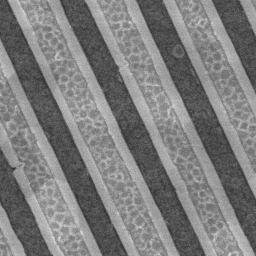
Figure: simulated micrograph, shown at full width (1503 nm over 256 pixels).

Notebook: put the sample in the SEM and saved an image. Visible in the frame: one or a few lines or trenches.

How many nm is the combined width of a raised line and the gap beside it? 407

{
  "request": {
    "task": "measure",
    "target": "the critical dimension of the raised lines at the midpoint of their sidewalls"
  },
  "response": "206 nm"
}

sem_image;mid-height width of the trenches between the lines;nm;198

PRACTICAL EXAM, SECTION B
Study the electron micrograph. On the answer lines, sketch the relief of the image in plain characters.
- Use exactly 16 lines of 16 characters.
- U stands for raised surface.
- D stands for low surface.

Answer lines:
DUUUDDUUDDDUUDDD
DDUUDDUUUDDUUUDD
DDUUDDDUUDDDUUDD
DDUUUDDUUUDDUUUD
UDDUUDDDUUDDDUUD
UDDUUUDDUUUDDUUD
UUDDUUDDDUUDDDUU
UUDDUUUDDUUUDDUU
UUUDDUUDDDUUDDUU
DUUDDUUUDDUUUDDU
DUUDDDUUDDDUUDDU
DUUUDDUUUDDUUDDD
DDUUDDDUUDDDUUDD
DDUUUDDUUUDDUUDD
UDDUUDDDUUDDDUUD
UDDUUUDDUUUDDUUD